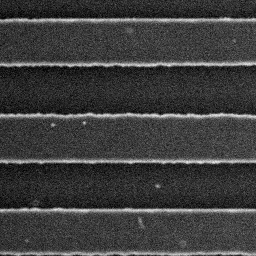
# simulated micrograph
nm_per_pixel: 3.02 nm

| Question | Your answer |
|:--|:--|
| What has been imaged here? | lines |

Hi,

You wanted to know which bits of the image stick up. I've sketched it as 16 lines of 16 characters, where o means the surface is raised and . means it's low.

................
oooooooooooooooo
oooooooooooooooo
oooooooooooooooo
................
................
................
oooooooooooooooo
oooooooooooooooo
oooooooooooooooo
................
................
................
oooooooooooooooo
oooooooooooooooo
oooooooooooooooo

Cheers